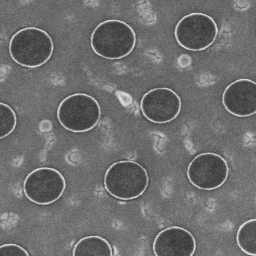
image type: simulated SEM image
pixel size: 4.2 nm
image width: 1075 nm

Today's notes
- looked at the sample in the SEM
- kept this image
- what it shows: a regular array of raised bodies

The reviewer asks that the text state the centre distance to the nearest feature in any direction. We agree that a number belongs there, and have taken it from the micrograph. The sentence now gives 340 nanometres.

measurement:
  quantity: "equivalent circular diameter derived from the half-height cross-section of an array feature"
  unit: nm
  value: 166